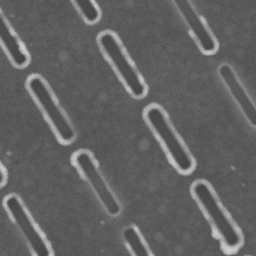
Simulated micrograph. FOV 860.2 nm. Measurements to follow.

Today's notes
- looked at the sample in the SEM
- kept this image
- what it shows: holes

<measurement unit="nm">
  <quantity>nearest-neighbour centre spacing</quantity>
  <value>283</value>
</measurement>